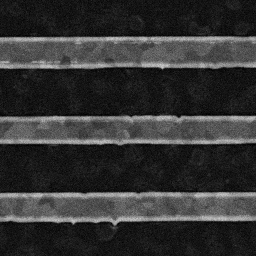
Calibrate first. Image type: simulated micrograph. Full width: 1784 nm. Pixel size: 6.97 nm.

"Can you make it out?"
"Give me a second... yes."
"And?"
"one or a few lines or trenches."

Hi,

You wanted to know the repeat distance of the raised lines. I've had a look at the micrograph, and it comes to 0.54 microns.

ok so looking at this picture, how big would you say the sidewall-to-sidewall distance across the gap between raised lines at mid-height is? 370 nanometres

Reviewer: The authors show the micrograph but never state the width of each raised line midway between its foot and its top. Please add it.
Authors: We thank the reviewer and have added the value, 170 nm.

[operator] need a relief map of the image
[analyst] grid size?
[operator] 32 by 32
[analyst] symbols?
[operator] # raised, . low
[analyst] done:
................................
................................
................................
................................
................................
################################
################################
################################
................................
................................
................................
................................
................................
................................
................................
################################
################################
################################
................................
................................
................................
................................
................................
................................
################################
################################
################################
.......#.#.####.................
................................
................................
................................
................................